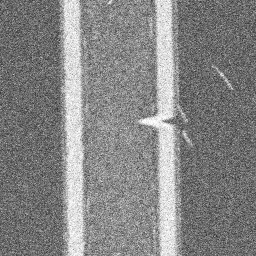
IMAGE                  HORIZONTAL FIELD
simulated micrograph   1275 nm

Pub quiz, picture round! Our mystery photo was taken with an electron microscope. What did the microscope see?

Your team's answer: one or a few lines or trenches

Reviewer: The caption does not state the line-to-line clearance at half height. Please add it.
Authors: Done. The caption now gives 456 nm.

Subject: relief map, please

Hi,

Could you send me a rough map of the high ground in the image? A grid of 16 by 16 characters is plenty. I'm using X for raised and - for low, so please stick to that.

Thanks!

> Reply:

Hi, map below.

XXXXX-----XXXXXX
XXXX------XXXXXX
XXXXX-----XXXXXX
XXXXX-----XXXXXX
XXXXX-----XXXXXX
XXXXX-----XXXXXX
XXXXX-----XXXXXX
XXXXX-----XXXXXX
XXXXX-----XXXXXX
XXXXX-----XXXXXX
XXXXX-----XXXXXX
XXXXX-----XXXXXX
XXXXX-----XXXXXX
XXXXX-----XXXXXX
XXXXX-----XXXXXX
XXXXX-----XXXXXX